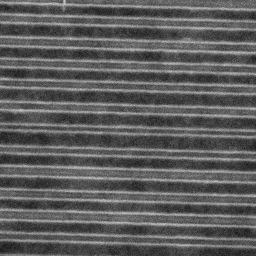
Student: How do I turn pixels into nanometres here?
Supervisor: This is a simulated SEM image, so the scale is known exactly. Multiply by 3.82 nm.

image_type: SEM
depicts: parallel lines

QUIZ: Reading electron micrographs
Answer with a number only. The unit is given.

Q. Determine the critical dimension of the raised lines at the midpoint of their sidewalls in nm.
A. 52.1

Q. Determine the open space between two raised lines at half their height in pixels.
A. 7.25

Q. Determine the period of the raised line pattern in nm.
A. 83.1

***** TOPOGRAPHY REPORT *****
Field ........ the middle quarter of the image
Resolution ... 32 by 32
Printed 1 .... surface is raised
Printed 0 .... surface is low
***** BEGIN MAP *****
00000000000000000000000000000000
11111111111000000000000000000000
11111111111111111111111111111111
11111111111111111111111111111111
00000000000001111111111111111111
00000000000000000000000000000000
11100001111000000000000000000000
11111111111111111111111111111111
11111111111111111111111111111111
11111111111111111111111111111111
00000000000000000000000011111111
00000000000000000000000000000000
11111111111111111111111000000000
11111111111111111111111111111111
11111111111111111111111111111111
00000000111111111111111111111111
00000000000000000000000000000000
11111111111111100000000000000000
11111111111111111111111111111111
11111111111111111111111111111111
11111111111111111111111111111111
00000000000000000000000001111111
00000000000000000000000000000000
11111111111111111111111111000000
11111111111111111111111111111111
11111111111111111111111111111111
00000000000000000000000000001111
00000000000000000000000000000000
11000000000000000000000000000000
11111111111111111111111111111111
11111111111111111111111111111111
11111111111111111111111111111111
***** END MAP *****